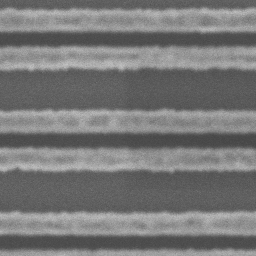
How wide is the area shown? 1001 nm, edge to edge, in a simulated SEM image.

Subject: lines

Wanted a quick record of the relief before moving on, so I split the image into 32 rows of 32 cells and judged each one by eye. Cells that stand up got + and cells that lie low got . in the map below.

................................
++++++++++++++++++++++++++++++++
++++++++++++++++++++++++++++++++
++++++++++++++++++++++++++++++++
................................
................................
++++++++++++++++++++++++++++++++
++++++++++++++++++++++++++++++++
++++++++....+..++.......++....++
................................
................................
................................
................................
................................
++++++++++++++++++++++++++++++++
++++++++++++++++++++++++++++++++
++++++++++++++++++++++++++++++++
................................
...+.+................+.........
++++++++++++++++++++++++++++++++
++++++++++++++++++++++++++++++++
................................
................................
................................
................................
................................
................................
++++++++++++++++++++++++++++++++
++++++++++++++++++++++++++++++++
................................
................................
++++++++++++++++++++++++++++++++